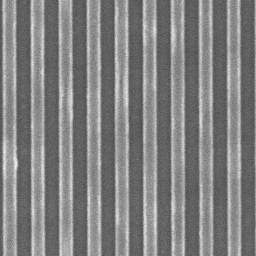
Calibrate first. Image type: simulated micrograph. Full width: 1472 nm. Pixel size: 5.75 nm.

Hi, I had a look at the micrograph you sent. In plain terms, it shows parallel lines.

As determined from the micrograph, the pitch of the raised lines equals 0.161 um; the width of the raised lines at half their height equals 12.2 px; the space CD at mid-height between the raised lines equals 90.6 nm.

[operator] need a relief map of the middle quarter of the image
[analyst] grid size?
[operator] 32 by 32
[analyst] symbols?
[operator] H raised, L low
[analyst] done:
HHLLLLHHHLLLLHHHLLLLHHHLLLLHHHLL
HHLLLLHHHLLLLHHHLLLLHHHLLLLHHHLL
HHLLLLHHHLLLLHHHLLLLHHHLLLLHHHLL
HHLLLLHHHLLLLHHHLLLLHHHLLLLHHHLL
HHLLLLHHHLLLLHHHLLLLHHHLLLLHHHLL
HHLLLLHHHLLLLHHHLLLLHHHLLLLHHHLL
HHLLLLHHHLLLLHHHLLLLHHHLLLLHHHLL
HHLLLLHHHLLLLHHHLLLLHHHLLLLHHHLL
HHLLLLHHHLLLLHHHLLLLHHHLLLLHHHLL
HHLLLLHHHLLLLHHHLLLLHHHLLLLHHHLL
HHLLLLHHHLLLLHHHLLLLHHHLLLLHHHLL
HHLLLLHHHLLLLHHHLLLLHHHLLLLHHHLL
HHLLLLHHHLLLLHHHLLLLHHHLLLLHHHLL
HHLLLLHHHLLLLHHHLLLLHHHLLLLHHHLL
HHLLLLHHHLLLLHHHLLLLHHHLLLLHHHLL
HHLLLLHHHLLLLHHHLLLLHHHLLLLHHHLL
HHLLLLHHHLLLLHHHLLLLHHHLLLLHHHLL
HHLLLLHHHLLLLHHHLLLLHHHLLLLHHHLL
HHLLLLHHHLLLLHHHLLLLHHHLLLLHHHLL
HHLLLLHHHLLLLHHHLLLLHHHLLLLHHHLL
HHLLLLHHHLLLLHHHLLLLHHHLLLLHHHLL
HHLLLLHHHLLLLHHHLLLLHHHLLLLHHHLL
HHLLLLHHHLLLLHHHLLLLHHHLLLLHHHLL
HHLLLLHHHLLLLHHHLLLLHHHLLLLHHHLL
HHLLLLHHHLLLLHHHLLLLHHHLLLLHHHLL
HHLLLLHHHLLLLHHHLLLLHHHLLLLHHHLL
HHLLLLHHHLLLLHHHLLLLHHHLLLLHHHLL
HHLLLLHHHLLLLHHHLLLLHHHLLLLHHHLL
HHLLLLHHHLLLLHHHLLLLHHHLLLLHHHLL
HHLLLLHHHLLLLHHHLLLLHHHLLLLHHHLL
HHLLLLHHHLLLLHHHLLLLHHHLLLLHHHLL
HHLLLLHHHLLLLHHHLLLLHHHLLLLHHHLL